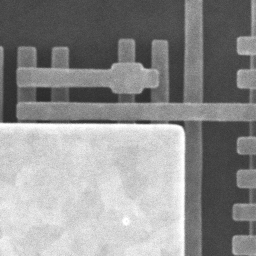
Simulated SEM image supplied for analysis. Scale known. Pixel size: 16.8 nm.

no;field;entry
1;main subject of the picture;wiring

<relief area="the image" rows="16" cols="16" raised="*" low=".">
................
................
................
................
................
................
................
................
************....
************....
************....
************....
************....
************....
************....
************....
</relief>